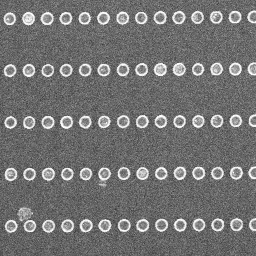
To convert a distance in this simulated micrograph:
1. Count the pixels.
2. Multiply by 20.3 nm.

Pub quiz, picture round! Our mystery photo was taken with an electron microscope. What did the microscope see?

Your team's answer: a regular array of raised bodies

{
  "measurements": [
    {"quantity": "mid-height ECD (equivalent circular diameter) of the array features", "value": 228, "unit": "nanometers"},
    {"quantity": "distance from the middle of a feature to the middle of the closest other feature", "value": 0.378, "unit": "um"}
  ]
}